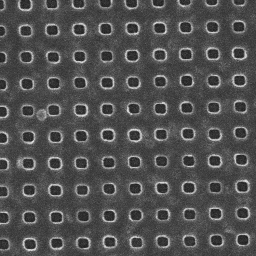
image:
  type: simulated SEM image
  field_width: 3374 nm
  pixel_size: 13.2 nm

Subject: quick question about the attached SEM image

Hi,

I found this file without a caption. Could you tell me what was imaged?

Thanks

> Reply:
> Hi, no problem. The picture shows a regular array of holes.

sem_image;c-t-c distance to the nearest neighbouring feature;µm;0.344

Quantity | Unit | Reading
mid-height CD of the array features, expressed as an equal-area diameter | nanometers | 151